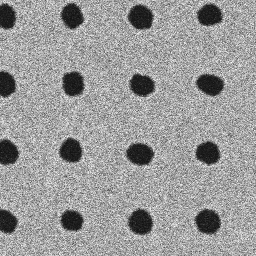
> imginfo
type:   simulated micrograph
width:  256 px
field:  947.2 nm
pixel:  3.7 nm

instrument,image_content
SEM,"a regular array of holes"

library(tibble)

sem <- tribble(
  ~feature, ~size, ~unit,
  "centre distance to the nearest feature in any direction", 251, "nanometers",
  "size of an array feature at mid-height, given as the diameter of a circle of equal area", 23.7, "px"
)